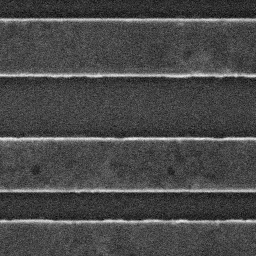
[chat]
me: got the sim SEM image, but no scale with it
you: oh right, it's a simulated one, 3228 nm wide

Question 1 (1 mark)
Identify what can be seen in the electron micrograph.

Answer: lines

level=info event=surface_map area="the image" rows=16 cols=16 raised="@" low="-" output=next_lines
----------------
@@@@@@@@@@@@@@@@
@@@@@@@@@@@@@@@@
@@@@@@@@@@@@@@@@
@@@@@@@@@@@@@@@@
----------------
----------------
----------------
----------------
@@@@@@@@@@@@@@@@
@@@@@@@@@@@@@@@@
@@@@@@@@@@@@@@@@
----------------
----------------
@@@@@@@@@@@@@@@@
@@@@@@@@@@@@@@@@